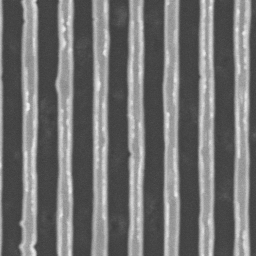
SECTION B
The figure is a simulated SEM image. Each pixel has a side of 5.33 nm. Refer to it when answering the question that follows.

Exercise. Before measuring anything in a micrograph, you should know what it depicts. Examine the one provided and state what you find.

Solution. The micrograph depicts parallel lines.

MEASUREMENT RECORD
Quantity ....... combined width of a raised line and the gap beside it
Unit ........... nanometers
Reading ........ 188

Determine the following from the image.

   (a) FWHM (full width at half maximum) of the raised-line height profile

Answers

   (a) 12.7 px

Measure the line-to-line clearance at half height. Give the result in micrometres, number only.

0.12